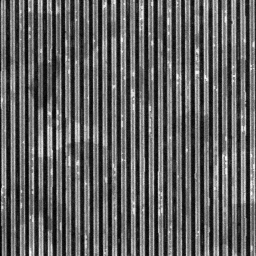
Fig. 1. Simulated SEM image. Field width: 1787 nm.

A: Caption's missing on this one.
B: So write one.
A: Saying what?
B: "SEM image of parallel lines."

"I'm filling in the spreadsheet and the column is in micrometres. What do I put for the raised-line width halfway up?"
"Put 0.034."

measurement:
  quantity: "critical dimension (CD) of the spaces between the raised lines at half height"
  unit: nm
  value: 34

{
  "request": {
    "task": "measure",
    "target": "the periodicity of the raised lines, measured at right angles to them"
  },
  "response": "64.3 nanometres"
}